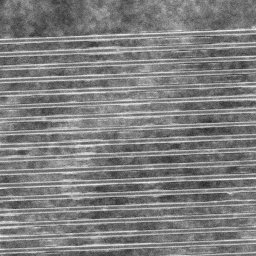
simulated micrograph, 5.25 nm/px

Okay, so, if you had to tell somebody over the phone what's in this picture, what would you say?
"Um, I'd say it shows parallel lines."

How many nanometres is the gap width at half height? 44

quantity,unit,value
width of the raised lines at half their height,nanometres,23.6